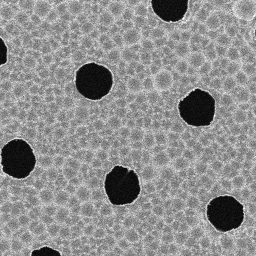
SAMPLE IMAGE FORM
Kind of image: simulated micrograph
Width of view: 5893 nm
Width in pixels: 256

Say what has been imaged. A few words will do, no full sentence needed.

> holes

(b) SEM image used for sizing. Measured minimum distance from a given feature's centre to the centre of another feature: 2470 nm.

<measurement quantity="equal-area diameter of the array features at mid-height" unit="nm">849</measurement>